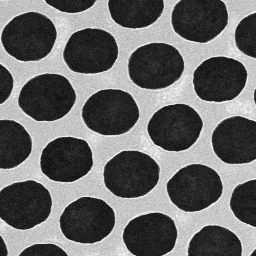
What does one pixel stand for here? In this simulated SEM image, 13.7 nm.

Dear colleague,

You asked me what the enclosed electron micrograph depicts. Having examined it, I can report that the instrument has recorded a regular array of holes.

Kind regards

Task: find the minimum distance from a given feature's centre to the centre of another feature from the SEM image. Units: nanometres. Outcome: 874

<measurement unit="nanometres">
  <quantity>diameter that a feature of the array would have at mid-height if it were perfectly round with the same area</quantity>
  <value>699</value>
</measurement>